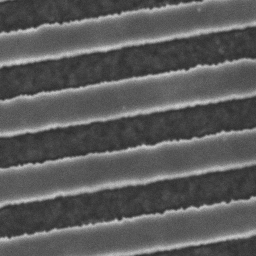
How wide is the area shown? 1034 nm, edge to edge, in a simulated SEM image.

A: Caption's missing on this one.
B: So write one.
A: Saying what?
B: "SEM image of lines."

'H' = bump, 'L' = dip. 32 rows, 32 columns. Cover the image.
LLLLLLLLLLLLLLLLLLLLLLHHHHHHHHHH
LLLLLLLLLLLLLLLLHHHHHHHHHHHHHHHH
LLLLLLLLLLHHHHHHHHHHHHHHHHHHHHHH
LLLLHHHHHHHHHHHHHHHHHHHHHHHHHHHL
HHHHHHHHHHHHHHHHHHHHHHHHLLLLLLLL
HHHHHHHHHHHHHHHHHHLLLLLLLLLLLLLL
HHHHHHHHHHHHLLLLLLLLLLLLLLLLLLLL
HHHHHHLLLLLLLLLLLLLLLLLLLLLLLLHH
LLLLLLLLLLLLLLLLLLLLLLLLHHHHHHHH
LLLLLLLLLLLLLLLLLLHHHHHHHHHHHHHH
LLLLLLLLLLLLHHHHHHHHHHHHHHHHHHHH
LLLLLLLHHHHHHHHHHHHHHHHHHHHHHHHH
LHHHHHHHHHHHHHHHHHHHHHHHHHHHHLLL
HHHHHHHHHHHHHHHHHHHHHHHLLLLLLLLL
HHHHHHHHHHHHHHHHLLLLLLLLLLLLLLLL
HHHHHHHHHHLLLLLLLLLLLLLLLLLLLLLL
HHHHLLLLLLLLLLLLLLLLLLLLLLLHHHHH
LLLLLLLLLLLLLLLLLLLLLLLLHHHHHHHH
LLLLLLLLLLLLLLLLHHHHHHHHHHHHHHHH
LLLLLLLLLLHHHHHHHHHHHHHHHHHHHHHH
LLLHHHHHHHHHHHHHHHHHHHHHHHHHHHHH
HHHHHHHHHHHHHHHHHHHHHHHHHHLLLLLL
HHHHHHHHHHHHHHHHHHHHLLLLLLLLLLLL
HHHHHHHHHHHHHHLLLLLLLLLLLLLLLLLL
HHHHHHHLLLLLLLLLLLLLLLLLLLLLLLLL
HHLLLLLLLLLLLLLLLLLLLLLLLLLHHHHH
LLLLLLLLLLLLLLLLLLLLLHHHHHHHHHHH
LLLLLLLLLLLLLLLHHHHHHHHHHHHHHHHH
LLLLLLLLLHHHHHHHHHHHHHHHHHHHHHHH
LLHHHHHHHHHHHHHHHHHHHHHHHHHHHHHH
HHHHHHHHHHHHHHHHHHHHHHHHHHLLLLLL
HHHHHHHHHHHHHHHHHHHLLLLLLLLLLLLL